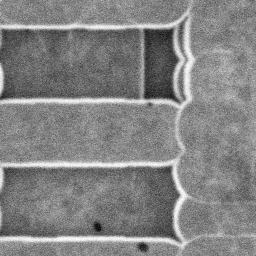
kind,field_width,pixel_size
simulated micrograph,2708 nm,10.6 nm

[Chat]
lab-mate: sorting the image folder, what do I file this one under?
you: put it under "wiring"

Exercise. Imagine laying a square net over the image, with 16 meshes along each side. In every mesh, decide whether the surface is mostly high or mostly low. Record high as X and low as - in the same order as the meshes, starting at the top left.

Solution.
XXXXXXXXXXXXXXXX
XXXXXXXXXXXXXXXX
------------XXXX
------------XXXX
------------XXXX
------------XXXX
XXXXXXXXXXXXXXXX
XXXXXXXXXXXXXXXX
XXXXXXXXXXXXXXXX
XXXXXXXXXXXXXXXX
-----------XXXXX
-----------XXXXX
-----------XXXXX
-----------XXXXX
-----------XXXXX
XXXXXXXXXXXXXXXX